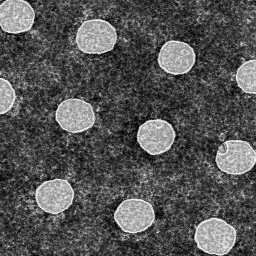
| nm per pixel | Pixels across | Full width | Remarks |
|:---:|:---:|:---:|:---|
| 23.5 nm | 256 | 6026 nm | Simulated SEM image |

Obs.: raised bodies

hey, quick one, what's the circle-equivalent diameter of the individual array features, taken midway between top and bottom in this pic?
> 843 nanometres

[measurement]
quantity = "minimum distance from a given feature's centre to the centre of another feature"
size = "1920 nanometres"